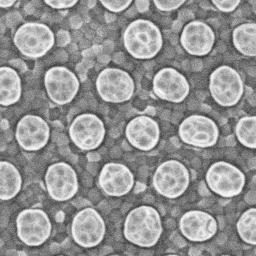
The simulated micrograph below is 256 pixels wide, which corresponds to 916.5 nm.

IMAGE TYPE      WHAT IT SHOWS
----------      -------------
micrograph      a regular array of raised bodies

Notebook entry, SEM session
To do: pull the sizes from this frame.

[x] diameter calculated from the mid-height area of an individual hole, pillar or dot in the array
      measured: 121 nm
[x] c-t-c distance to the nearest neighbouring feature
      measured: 193 nanometres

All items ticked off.